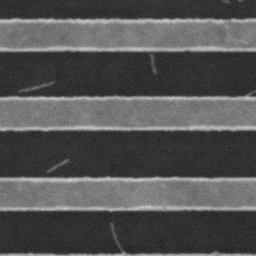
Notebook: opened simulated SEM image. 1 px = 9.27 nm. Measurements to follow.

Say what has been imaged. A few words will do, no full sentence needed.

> lines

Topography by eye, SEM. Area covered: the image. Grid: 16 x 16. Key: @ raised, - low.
----------------
@@@@@@@@@@@@@@@@
@@@@@@@@@@@@@@@@
----------------
----------------
----------------
@@@@@@@@@@@@@@@@
@@@@@@@@@@@@@@@@
----------------
----------------
----------------
@@@@@@@@@@@@@@@@
@@@@@@@@@@@@@@@@
----------------
----------------
----------------